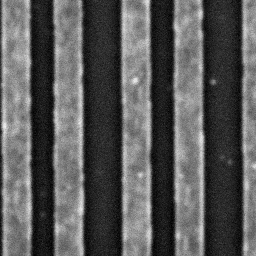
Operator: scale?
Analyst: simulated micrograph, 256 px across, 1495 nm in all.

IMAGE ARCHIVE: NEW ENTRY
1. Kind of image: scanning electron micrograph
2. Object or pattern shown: lines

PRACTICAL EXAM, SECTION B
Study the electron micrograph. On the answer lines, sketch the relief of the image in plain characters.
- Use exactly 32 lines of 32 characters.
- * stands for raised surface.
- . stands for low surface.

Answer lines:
****...***.....****...***.....**
****...***.....****...***.....**
****...***.....****...***.....**
****...***.....****...***.....**
****...***.....****...***.....**
****...***.....****...***.....**
****...***.....****...***.....**
****...***.....****...***.....**
****...***.....****...***......*
****...***.....****...***.....**
****...***.....****...***.....**
****...***.....****...***.....**
****...***.....****...***.....**
****...***.....****...***.....**
****...***.....****...***.....**
****...***.....****...***.....**
****...***.....****...***.....**
****...***.....****...***.....**
****...***.....****...***.....**
****...***.....****...***......*
****...***.....****...***......*
****...***.....****...***......*
****...***.....****...***......*
****...***.....****...***......*
****...***.....****...***......*
****...***.....****...***......*
****...***.....****...***......*
****...***.....****...***......*
****...***.....****...***......*
****...***.....****...***......*
****...***.....****...***......*
****...***.....****...***.....**